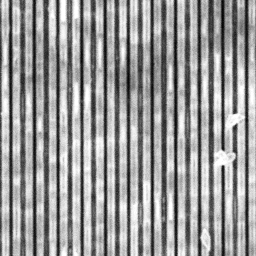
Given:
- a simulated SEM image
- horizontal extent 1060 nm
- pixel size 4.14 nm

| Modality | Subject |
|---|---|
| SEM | parallel lines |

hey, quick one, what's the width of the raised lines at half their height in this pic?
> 28.5 nm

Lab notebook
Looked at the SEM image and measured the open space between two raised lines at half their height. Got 18.1 nm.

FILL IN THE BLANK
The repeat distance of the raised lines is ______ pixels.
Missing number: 11.7